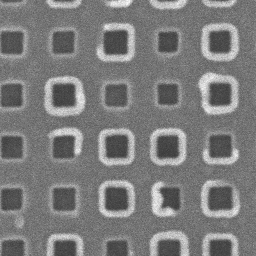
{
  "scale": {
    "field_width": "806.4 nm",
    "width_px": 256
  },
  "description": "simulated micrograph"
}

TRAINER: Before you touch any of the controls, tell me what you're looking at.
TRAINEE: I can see a regular array of holes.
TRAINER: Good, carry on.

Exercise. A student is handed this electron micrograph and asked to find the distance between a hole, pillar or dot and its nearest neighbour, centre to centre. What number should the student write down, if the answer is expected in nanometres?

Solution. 163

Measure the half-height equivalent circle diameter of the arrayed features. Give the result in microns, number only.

0.0816